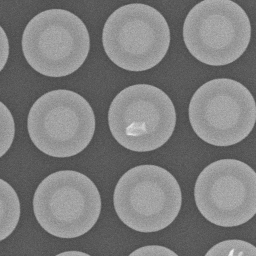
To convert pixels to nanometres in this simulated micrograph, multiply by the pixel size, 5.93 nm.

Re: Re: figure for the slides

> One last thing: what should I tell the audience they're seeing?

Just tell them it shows an array of small figures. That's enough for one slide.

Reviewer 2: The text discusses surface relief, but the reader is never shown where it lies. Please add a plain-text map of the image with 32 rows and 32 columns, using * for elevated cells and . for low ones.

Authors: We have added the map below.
.................*.......*****..
.....****.....******....*******.
....******...********..********.
...********..********..********.
*..********..********..********.
*..********..********..********.
*..********..********...******..
*..********...******.....****...
....******.....****.............
......**........................
..........................****..
......***......*****....*******.
.....******...*******...********
*...*******...********..********
*...********..********..********
**.*********..********..********
**..********..********..*******.
**..*******....******....*****..
*....******.....****............
.......**.......................
..........................*****.
.......***......*****....*******
.....******....*******...*******
**...*******..********..********
**..********..*********.********
**..*********.*********..*******
**..*********..*******...*******
**...*******...*******....*****.
**...******.....****............
*......***......................
...........................****.
........**.......*****....******